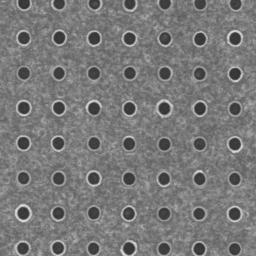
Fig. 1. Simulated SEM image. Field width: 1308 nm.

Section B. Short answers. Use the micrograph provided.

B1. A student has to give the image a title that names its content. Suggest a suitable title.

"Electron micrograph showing a regular array of holes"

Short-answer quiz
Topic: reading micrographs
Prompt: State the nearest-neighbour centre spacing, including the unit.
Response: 178 nm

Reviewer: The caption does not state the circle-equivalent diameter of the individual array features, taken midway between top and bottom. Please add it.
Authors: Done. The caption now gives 12.8 px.